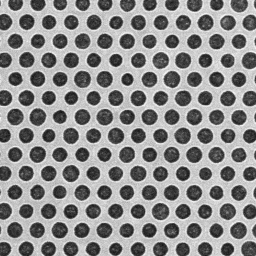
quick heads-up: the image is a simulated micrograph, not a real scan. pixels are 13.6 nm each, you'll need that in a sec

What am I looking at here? a regular array of holes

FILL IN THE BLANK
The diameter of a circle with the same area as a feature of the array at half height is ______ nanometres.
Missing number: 215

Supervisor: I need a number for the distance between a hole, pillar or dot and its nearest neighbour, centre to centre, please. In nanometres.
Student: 295